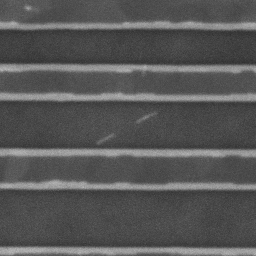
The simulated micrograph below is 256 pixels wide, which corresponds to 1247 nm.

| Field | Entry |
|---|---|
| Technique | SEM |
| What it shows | one or a few lines or trenches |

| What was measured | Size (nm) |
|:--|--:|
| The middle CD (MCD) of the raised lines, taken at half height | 161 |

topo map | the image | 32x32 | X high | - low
XXXXXXXXXXXXXXXXXXXXXXXXXXXXXXXX
XXXXXXXXXXXXXXXXXXXXXXXXXXXXXXXX
XXXXXXXXXXXXXXXXXXXXXXXXXXXXXXXX
--------------------------------
--------------------------------
--------------------------------
--------------------------------
--------------------------------
XXXXXXXXXX-XXXXXXXX--------XXXXX
XXXXXXXXXXXXXXXXXXXXXXXXXXXXXXXX
XXXXXXXXXXXXXXXXXXXXXXXXXXXXXXXX
XXXXXXXXXXXXXXXXXXXXXXXXXXXXXXXX
--------------------------------
--------------------------------
--------------------------------
--------------------------------
--------------------------------
--------------------------------
--------------------------------
XXXXXXXXXXXXXXXXXXXXXXXXXXXXXXXX
XXXXXXXXXXXXXXXXXXXXXXXXXXXXXXXX
XXXXXXXXXXXXXXXXXXXXXXXXXXXXXXXX
XXXXXXXXXXXXXXXXXXXXXXXXXXXXXXXX
--------------------------------
--------------------------------
--------------------------------
--------------------------------
--------------------------------
--------------------------------
--------------------------------
--------------------------------
XXXXXXXXXXXXXXXXXXXXXXXXXXXXXXXX